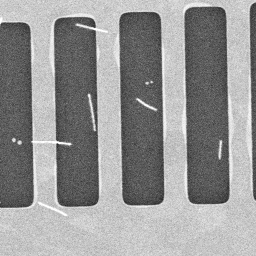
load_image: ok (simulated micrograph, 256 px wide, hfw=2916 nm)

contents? groups of lines, slits or small figures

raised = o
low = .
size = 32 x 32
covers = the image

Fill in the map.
oooooooooooooooooooooooooooooooo
ooooooooooooooooo..oooo.....ooo.
ooooooo.....ooo.....ooo.....ooo.
....ooo.....ooo.....ooo.....ooo.
....oo......ooo.....ooo.....ooo.
....oo......ooo.....ooo.....ooo.
....oo......ooo.....ooo.....ooo.
....oo......ooo.....ooo......oo.
....ooo.....ooo.....ooo......oo.
....ooo.....ooo.....ooo......oo.
....ooo.....ooo.....ooo......oo.
....ooo.....ooo......oo......oo.
....ooo.....ooo......oo......oo.
....ooo.....ooo......oo......oo.
....ooo.....ooo......oo......oo.
....ooo.....ooo......oo......oo.
....ooo.....ooo......oo......oo.
....ooo.....ooo......oo......oo.
....ooo.....ooo......oo......oo.
....ooo.....ooo......oo......oo.
....ooo......oo......oo......oo.
....ooo......oo......oo......oo.
....ooo......oo......oo......oo.
....ooo......oo......oo......oo.
....ooo.....ooo......oo......ooo
....ooo.....oooo....oooo....oooo
oooooooooooooooooooooooooooooooo
oooooooooooooooooooooooooooooooo
oooooooooooooooooooooooooooooooo
oooooooooooooooooooooooooooooooo
oooooooooooooooooooooooooooooooo
oooooooooooooooooooooooooooooooo